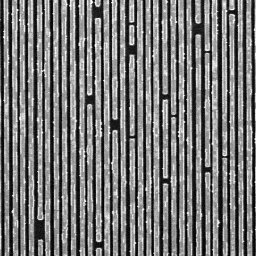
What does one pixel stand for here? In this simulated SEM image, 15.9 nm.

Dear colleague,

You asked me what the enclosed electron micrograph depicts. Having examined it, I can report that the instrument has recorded parallel lines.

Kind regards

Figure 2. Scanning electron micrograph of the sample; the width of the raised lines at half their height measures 67.7 nm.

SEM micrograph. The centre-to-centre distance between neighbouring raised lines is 133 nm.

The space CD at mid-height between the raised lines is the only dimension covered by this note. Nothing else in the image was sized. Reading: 53.8 nanometers